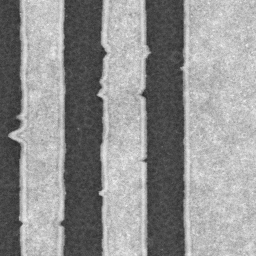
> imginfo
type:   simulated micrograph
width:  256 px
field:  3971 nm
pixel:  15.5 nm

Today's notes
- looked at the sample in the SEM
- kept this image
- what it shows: one or a few lines or trenches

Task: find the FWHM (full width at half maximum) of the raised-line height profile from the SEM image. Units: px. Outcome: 36.8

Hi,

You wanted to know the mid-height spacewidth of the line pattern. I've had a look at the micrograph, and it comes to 694 nanometres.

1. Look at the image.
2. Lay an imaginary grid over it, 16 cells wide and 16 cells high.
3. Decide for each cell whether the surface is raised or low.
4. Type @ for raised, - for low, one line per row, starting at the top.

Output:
-@@@---@@---@@@@
--@@---@@---@@@@
--@@---@@---@@@@
--@@---@@---@@@@
--@@---@@---@@@@
--@@--@@@---@@@@
--@@---@@---@@@@
--@@---@@---@@@@
-@@@---@@---@@@@
--@@---@@---@@@@
-@@@---@@---@@@@
--@@---@@---@@@@
--@@---@@---@@@@
--@@---@@---@@@@
--@@---@@---@@@@
--@@---@@---@@@@